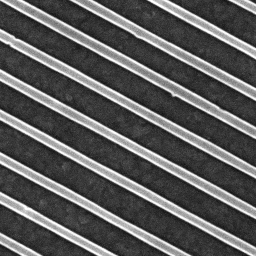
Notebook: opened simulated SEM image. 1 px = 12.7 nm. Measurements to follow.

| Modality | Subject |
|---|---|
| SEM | parallel lines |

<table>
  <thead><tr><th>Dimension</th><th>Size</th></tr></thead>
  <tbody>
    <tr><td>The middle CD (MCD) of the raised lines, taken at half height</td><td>108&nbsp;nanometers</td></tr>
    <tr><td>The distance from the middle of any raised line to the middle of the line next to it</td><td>452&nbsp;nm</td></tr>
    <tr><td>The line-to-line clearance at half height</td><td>347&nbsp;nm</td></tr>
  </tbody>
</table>